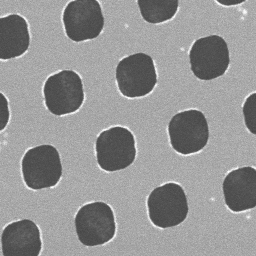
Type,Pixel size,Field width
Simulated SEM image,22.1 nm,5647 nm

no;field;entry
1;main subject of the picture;a regular array of holes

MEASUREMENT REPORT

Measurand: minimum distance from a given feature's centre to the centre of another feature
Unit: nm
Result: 1650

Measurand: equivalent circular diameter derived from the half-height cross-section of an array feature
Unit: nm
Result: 953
